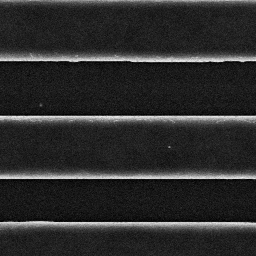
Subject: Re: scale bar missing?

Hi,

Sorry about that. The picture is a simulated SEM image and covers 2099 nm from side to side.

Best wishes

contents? lines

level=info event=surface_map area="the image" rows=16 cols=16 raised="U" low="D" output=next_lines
UUUUUUUUUUUUUUUU
UUUUUUUUUUUUUUUU
UUUUUUUUUUUUUUUU
UUUUUUUUUUUUUUUU
DDDDDDDDDDDDDDDD
DDDDDDDDDDDDDDDD
DDDDDDDDDDDDDDDD
UUUUUUUUUUUUUUUU
UUUUUUUUUUUUUUUU
UUUUUUUUUUUUUUUU
UUUUUUUUUUUUUUUU
DDDDDDDDDDDDDDDD
DDDDDDDDDDDDDDDD
DDDDDDDDDDDDDDDD
UUUUUUUUUUUUUUUU
UUUUUUUUUUUUUUUU